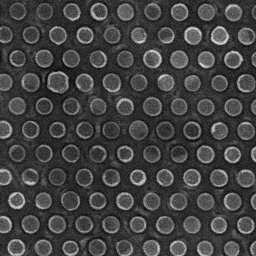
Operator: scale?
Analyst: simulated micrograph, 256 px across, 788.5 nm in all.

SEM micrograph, a regular array of raised bodies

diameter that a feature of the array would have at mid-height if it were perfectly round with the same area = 0.0523 µm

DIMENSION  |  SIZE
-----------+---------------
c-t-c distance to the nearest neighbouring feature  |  82.5 nm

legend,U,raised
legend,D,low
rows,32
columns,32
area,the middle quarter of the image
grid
DUUDDDDUUUDDDDUUUDDDDUUDDDDDUUDD
DDDDDDDDDDDDDDDDDDDDDDDDDDDDDDDD
DDDDDDDDDDDDDDDDDDDDDDDDDDDDDDDD
UDDUUUUDDDUUUUDDDUUUDDDDUUUDDDDU
UDDUUUUDDDUUUUDDDUUUUDDDUUUDDDUU
UDDUUUUDDDUUUUDDDUUUUDDDUUUDDDUU
UDDDUUDDDDDUUUDDDDUUDDDDUUDDDDDU
DDDDDDDDDDDDDDDDDDDDDDDDDDDDDDDD
DDDDDDDDDDDDDDDDDDDDDDDDDDDDDDDD
UUUDDDDUUUDDDDUUUDDDUUUUDDDUUUDD
UUUUDDDUUUDDDUUUUDDDUUUUDDDUUUUD
UUUUDDDUUUDDDUUUUDDDUUUUDDDUUUUD
DUUDDDDDDDDDDDUUDDDDDUUUDDDDUUDD
DDDDDDDDDDDDDDDDDDDDDDDDDDDDDDDD
DDDDDDDDDDDDDDDDDDUDDDDDDDDDDDDD
DDDUUUUDDDUUUUDDDUUUUDDUUUUDDDUU
DDDUUUUDDDUUUUDDDUUUUDDUUUUDDDUU
DDDUUUUDDDUUUUDDDUUUUDDUUUUDDDUU
DDDDUUDDDDDUUDDDDUUUDDDDDUDDDDDU
DDDDDDDDDDDDDDDDDDDDDDDDDDDDDDDD
DUUDDDDDUDDDDDDDDDDDDUUDDDDDDDDD
UUUUDDDUUUDDDDUUUDDDUUUUDDDUUUDD
UUUUDDUUUUDDDUUUUDDDUUUUDDDUUUUD
UUUDDDDUUUDDDDUUUDDDUUUUDDDUUUUD
DUUDDDDDDDDDDDDDDDDDDDDDDDDDDUDD
DDDDDDDDDDDDDDDDDDDDDDDDDDDDDDDD
DDDDUUDDDDDUUDDDDDUDDDDDUDDDDDDU
DDDUUUUDDDUUUUDDDUUUDDDUUUUDDDUU
DDDUUUUDDDUUUUDDDUUUDDDUUUUDDDUU
DDDUUUUDDDUUUUDDDUUUDDDDUUUDDDUU
DDDDDDDDDDDDDDDDDDDDDDDDDUDDDDDD
DDDDDDDDDDDDDDDDDDDDDDDDDDDDDDDD